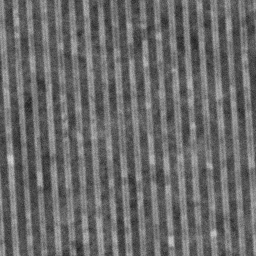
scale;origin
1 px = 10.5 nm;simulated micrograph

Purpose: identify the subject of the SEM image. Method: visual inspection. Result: parallel lines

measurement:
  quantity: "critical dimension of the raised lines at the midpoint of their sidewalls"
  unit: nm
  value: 38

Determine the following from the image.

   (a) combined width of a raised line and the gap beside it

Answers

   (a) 149 nanometres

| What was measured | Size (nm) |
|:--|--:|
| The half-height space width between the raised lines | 105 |